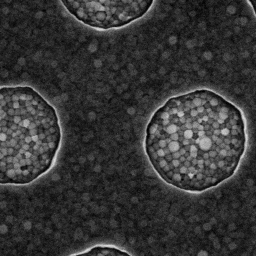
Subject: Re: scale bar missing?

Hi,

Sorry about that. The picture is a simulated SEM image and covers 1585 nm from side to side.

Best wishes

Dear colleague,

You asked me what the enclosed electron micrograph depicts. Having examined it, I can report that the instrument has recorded holes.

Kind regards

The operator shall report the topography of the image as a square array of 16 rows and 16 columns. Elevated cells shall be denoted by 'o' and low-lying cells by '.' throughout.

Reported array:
oooo.....ooooooo
ooooo...oooooooo
oooooooooooooooo
oooooooooooooooo
oooooooooooooooo
..oooooooooooooo
...ooooooo....oo
....ooooo......o
....ooooo......o
....ooooo......o
...ooooooo.....o
ooooooooooo...oo
oooooooooooooooo
oooooooooooooooo
oooooooooooooooo
oooooo.ooooooooo